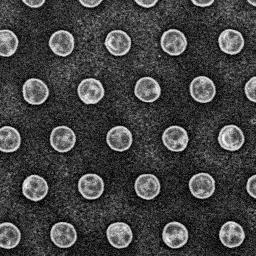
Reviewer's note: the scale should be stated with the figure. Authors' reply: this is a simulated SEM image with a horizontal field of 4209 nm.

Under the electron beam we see a regular array of raised bodies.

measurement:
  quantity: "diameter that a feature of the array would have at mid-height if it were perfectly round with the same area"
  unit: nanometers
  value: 412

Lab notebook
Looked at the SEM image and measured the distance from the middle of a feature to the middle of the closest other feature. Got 907 nm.